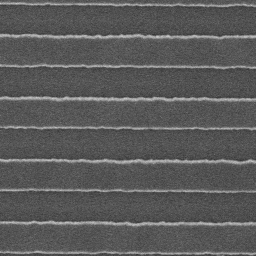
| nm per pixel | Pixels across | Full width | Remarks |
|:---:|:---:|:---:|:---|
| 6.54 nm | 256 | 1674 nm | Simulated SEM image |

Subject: lines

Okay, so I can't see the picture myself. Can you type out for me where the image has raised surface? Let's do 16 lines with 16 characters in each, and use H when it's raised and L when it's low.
LLLLLLLLLLLLLLLL
LLLLLLLLLLLLLLLL
HHHHHHHHHHHHHHHH
HHHHHHHHHHHHHHHH
LLLLLLLLLLLLLLLL
LLLLLLLLLLLLLLLL
HHHHHHHHHHHHHHHH
HHHHHHHHHHHHHHHH
LLLLLLLLLLLLLLLL
LLLLLLLLLLLLLLLL
HHHHHHHHHHHHHHHH
HHHHHHHHHHHHHHHH
LLLLLLLLLLLLLLLL
LLLLLLLLLLLLLLLL
HHHHHHHHHHHHHHHH
HHHHHHHHHHHHHHHH